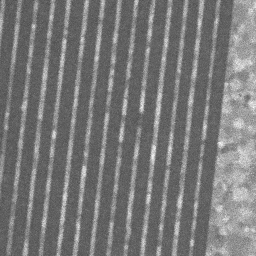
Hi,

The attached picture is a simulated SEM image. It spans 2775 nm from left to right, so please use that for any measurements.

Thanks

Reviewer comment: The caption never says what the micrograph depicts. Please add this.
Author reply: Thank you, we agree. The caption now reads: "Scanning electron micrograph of parallel lines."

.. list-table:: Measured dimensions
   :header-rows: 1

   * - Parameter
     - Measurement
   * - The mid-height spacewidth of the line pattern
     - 0.143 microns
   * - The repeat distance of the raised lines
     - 179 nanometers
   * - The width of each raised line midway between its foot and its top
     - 35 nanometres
